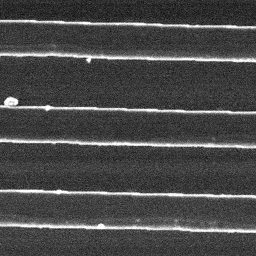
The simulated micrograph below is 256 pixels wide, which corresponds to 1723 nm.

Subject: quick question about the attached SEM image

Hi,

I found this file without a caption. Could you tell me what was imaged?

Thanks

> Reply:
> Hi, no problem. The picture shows lines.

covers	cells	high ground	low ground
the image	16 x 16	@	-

----------------
@@@@@@@@@-------
@@@@@@@@@@@@@@@@
-----@@@@@@@@@@@
----------------
----------------
@---------------
@@@@@@@@@@@@@@@@
@@@@@@@@@@@@@@@@
----------------
----------------
----------------
@@@@@@@@@@@@@@@@
@@@@@@@@@@@@@@@@
----------------
----------------